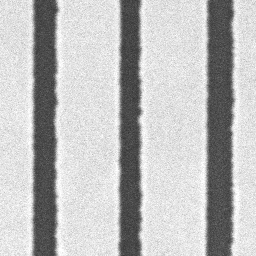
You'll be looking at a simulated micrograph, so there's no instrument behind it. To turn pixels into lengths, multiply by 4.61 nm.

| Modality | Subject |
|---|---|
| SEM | lines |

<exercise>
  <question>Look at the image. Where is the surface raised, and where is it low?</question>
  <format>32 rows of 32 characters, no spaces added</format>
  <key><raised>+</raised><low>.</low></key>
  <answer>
++++...++++++++...++++++++...+++
++++...++++++++..+++++++++...+++
++++...++++++++...++++++++...+++
++++...++++++++...++++++++...+++
++++...++++++++...++++++++...+++
++++...++++++++...++++++++...+++
++++...++++++++...++++++++...+++
++++...++++++++...++++++++...+++
++++...++++++++..+++++++++...+++
++++...++++++++...++++++++...+++
++++...++++++++...++++++++...+++
++++...++++++++...++++++++...+++
++++...++++++++...++++++++...+++
++++...++++++++...++++++++...+++
++++...++++++++...++++++++...+++
++++...++++++++..+++++++++...+++
++++...++++++++...++++++++...+++
++++...++++++++...++++++++...+++
++++...++++++++...++++++++...+++
++++...++++++++...++++++++...+++
++++...++++++++...++++++++...+++
++++...++++++++...++++++++...+++
++++...++++++++...++++++++...+++
++++...++++++++...++++++++...+++
++++...++++++++...++++++++...+++
++++...++++++++...++++++++...+++
++++...++++++++...++++++++...+++
++++...++++++++...++++++++...+++
++++...++++++++...++++++++...+++
++++...++++++++..+++++++++...+++
++++...++++++++...++++++++...+++
++++...++++++++...++++++++...+++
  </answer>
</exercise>